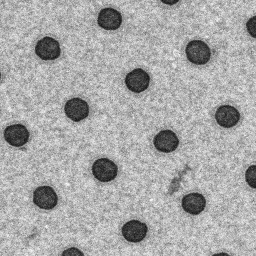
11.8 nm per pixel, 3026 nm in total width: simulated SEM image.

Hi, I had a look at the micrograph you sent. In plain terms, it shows a regular array of holes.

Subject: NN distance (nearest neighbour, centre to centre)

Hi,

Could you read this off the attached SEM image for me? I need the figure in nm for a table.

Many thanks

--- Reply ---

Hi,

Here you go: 780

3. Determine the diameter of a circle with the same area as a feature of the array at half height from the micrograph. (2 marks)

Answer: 292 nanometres